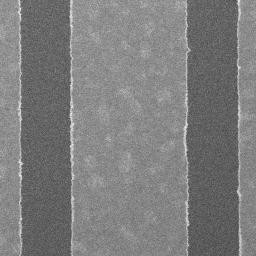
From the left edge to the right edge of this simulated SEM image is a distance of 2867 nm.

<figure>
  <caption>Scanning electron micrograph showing one or a few lines or trenches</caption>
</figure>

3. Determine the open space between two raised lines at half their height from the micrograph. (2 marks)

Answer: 573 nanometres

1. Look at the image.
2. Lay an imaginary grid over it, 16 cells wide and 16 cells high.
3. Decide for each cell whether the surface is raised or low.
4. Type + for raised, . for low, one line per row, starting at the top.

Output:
+...++++++++...+
+...++++++++...+
+...++++++++...+
+...++++++++...+
+...++++++++...+
+...++++++++...+
+...++++++++...+
+...++++++++...+
+...++++++++...+
+...++++++++...+
+...++++++++...+
+....+++++++...+
+...++++++++...+
+....+++++++...+
+....+++++++...+
+...++++++++...+